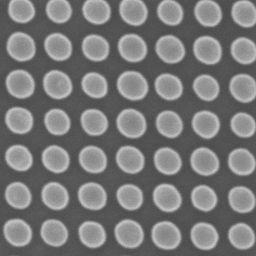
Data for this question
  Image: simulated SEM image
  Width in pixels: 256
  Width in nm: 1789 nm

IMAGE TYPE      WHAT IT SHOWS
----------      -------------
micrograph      a regular array of raised bodies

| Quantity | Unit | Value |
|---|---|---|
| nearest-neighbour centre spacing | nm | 257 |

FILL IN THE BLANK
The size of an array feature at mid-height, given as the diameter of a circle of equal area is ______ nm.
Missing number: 182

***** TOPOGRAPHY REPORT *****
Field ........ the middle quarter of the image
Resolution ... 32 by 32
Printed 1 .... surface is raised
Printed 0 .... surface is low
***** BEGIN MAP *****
00000000000000000000000000000000
00000000000000000000000000000000
00000011000000011110000000000000
10000111110000111111000011110000
10000111111000111111100111111000
11000111111000111111100111111000
11000111110000111111100111111000
10000011110000011111000011111000
00000000000000001110000001110000
00000000000000000000000000000000
00000000000000000000000000000000
00000000000000001100000000000000
00000111100000111110000011110000
10001111110001111111000111111000
10001111111001111111000111111000
10000111111001111111000111111000
10000111110000111111000011111000
00000000100000011110000001111000
00000000000000000000000000000000
00000000000000000000000000000000
00000000000000000000000000000000
00001111100000111100000011100000
10001111110001111110000111110000
10001111110001111111000111111000
10001111110001111111000111111000
10001111110000111111000111111000
00000011110000011110000011110000
00000000000000000000000000000000
00000000000000000000000000000000
00000000000000000000000000000000
00000111100000011000000011100000
00001111110000111110000111110000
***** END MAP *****